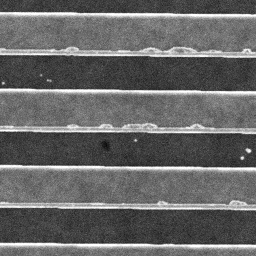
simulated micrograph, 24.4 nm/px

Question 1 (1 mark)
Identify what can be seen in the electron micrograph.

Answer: lines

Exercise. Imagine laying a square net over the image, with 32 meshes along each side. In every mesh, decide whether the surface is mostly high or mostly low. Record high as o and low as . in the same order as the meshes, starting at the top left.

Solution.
................................
................................
oooooooooooooooooooooooooooooooo
oooooooooooooooooooooooooooooooo
oooooooooooooooooooooooooooooooo
oooooooooooooooooooooooooooooooo
oooooooooooooooooooooooooooooooo
................................
................................
................................
................................
oooooooooooooooooooooooooooooo..
oooooooooooooooooooooooooooooooo
oooooooooooooooooooooooooooooooo
oooooooooooooooooooooooooooooooo
oooooooooooooooooooooooooooooooo
......................oooooooooo
................................
................................
................................
................................
oooooooooooooooooooooooooooooooo
oooooooooooooooooooooooooooooooo
oooooooooooooooooooooooooooooooo
oooooooooooooooooooooooooooooooo
oooooooooooooooooooooooooooooooo
................................
................................
................................
................................
................................
oooooooooooooooooooooooooooooooo